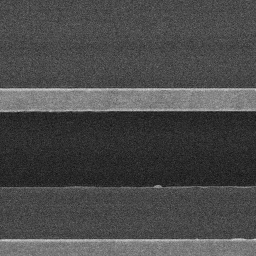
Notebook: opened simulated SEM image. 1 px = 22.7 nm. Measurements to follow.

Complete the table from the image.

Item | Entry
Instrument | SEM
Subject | lines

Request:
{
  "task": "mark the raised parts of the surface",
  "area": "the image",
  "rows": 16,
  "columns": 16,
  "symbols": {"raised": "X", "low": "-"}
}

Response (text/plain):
XXXXXXXXXXXXXXXX
XXXXXXXXXXXXXXXX
XXXXXXXXXXXXXXXX
XXXXXXXXXXXXXXXX
XXXXXXXXXXXXXXXX
XXXXXXXXXXXXXXXX
XXXXXXXXXXXXXXXX
----------------
----------------
----------------
----------------
----------------
XXXXXXXXXXXXXXXX
XXXXXXXXXXXXXXXX
XXXXXXXXXXXXXXXX
XXXXXXXXXXXXXXXX